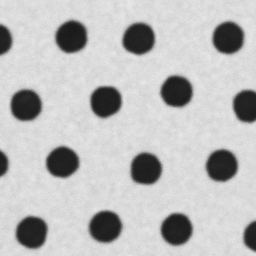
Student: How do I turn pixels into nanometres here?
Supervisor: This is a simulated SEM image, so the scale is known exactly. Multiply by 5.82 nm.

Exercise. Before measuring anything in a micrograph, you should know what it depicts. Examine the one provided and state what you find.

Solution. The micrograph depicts a regular array of holes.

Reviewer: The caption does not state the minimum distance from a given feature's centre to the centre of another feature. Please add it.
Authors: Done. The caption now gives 394 nanometers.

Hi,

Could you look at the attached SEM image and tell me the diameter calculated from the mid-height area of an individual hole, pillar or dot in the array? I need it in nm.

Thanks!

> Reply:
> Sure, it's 182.